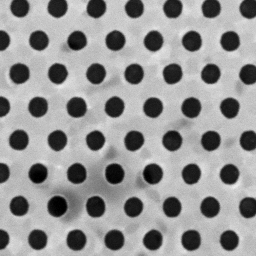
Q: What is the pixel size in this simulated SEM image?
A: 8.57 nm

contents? a regular array of holes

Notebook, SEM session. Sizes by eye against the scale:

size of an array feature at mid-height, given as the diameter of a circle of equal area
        181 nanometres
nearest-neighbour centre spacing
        38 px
